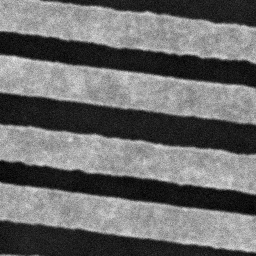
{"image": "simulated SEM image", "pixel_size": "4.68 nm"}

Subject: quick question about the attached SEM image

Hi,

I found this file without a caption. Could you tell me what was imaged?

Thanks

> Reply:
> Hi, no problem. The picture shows lines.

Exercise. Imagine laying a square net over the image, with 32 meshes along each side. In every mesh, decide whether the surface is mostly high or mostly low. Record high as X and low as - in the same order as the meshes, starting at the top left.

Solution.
XXXXXXXX------------------------
XXXXXXXXXXXXXXX-----------------
XXXXXXXXXXXXXXXXXXXXXXXX--------
XXXXXXXXXXXXXXXXXXXXXXXXXXXXXXX-
-----XXXXXXXXXXXXXXXXXXXXXXXXXXX
-------------XXXXXXXXXXXXXXXXXXX
---------------------XXXXXXXXXXX
XXXX---------------------------X
XXXXXXXXXXXX--------------------
XXXXXXXXXXXXXXXXXXXX------------
XXXXXXXXXXXXXXXXXXXXXXXXXXXX----
XXXXXXXXXXXXXXXXXXXXXXXXXXXXXXXX
--------XXXXXXXXXXXXXXXXXXXXXXXX
---------------XXXXXXXXXXXXXXXXX
-------------------------XXXXXXX
--------------------------------
XXXXXXXX------------------------
XXXXXXXXXXXXXXX-----------------
XXXXXXXXXXXXXXXXXXXXXXX---------
XXXXXXXXXXXXXXXXXXXXXXXXXXXXXXXX
---XXXXXXXXXXXXXXXXXXXXXXXXXXXXX
-----------XXXXXXXXXXXXXXXXXXXXX
--------------------XXXXXXXXXXXX
XXXXX----------------------XXXXX
XXXXXXXXXXXX--------------------
XXXXXXXXXXXXXXXXXXXX------------
XXXXXXXXXXXXXXXXXXXXXXXXXXXX----
-XXXXXXXXXXXXXXXXXXXXXXXXXXXXXXX
---------XXXXXXXXXXXXXXXXXXXXXXX
----------------XXXXXXXXXXXXXXXX
------------------------XXXXXXXX
--------------------------------